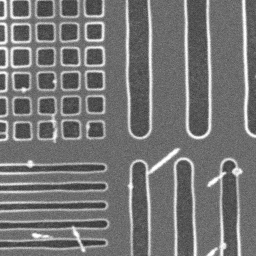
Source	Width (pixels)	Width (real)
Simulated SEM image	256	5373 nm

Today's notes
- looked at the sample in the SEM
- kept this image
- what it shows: groups of lines, slits or small figures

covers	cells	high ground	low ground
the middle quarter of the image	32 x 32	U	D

UUUUUUDDUUUUUUUUDDDDDDUUUUUUUUUD
UUUUUUUUUUUUUUUUDDDDDDUUUUUUUUUD
DDDDUUDDDDUUUUUUDDDDDDUUUUUUUUUD
DDDDUDDDDDUUUUUUDDDDDDUUUUUUUUUD
DDDDUDDDDDUUUUUUDDDDDDUUUUUUUUUD
DDDDUDDDDDUUUUUUDDDDDDUUUUUUUUUD
DDDUUUUDUUUUUUUUDDDDDDUUUUUUUUUD
UUUUUUUUUUUUUUUUDDDDDDUUUUUUUUUD
DDDDUUDDDDUUUUUUDDDDDDUUUUUUUUUD
DDDDUUDDDDUUUUUUDDDDDDUUUUUUUUUD
DDDDUUDDDDUUUUUUDDDDDDUUUUUUUUUD
DDDDUUDDDDUUUUUUDDDDDDUUUUUUUUUD
DDDUUUUUUUUUUUUUDDDDDDUUUUUUUUUD
UUUUUUUUUUUUUUUUDDDDDDUUUUUUUUUD
DDDDUUUDDUUUUUUUDDDDDDUUUUUUUUUD
DDDDUUDDDDUUUUUUDDDDDDUUUUUUUUUD
DDDDUUDDDDUUUUUUDDDDDUUUUUUUUUUD
DDDDUUDDDDUUUUUUUDDDDUUUUUUUUUUU
DDDDUUDDDUUUUUUUUUUUUUUUUUUUUUUU
UUUUUUUUUUUUUUUUUUUUUUUUUUUUUUUU
UUUUUUUUUUUUUUUUUUUUUUUUUUUUUUUU
UUUUUUUUUUUUUUUUUUUUUUUUUUUUUUUU
UUUUUUUUUUUUUUUUUUUUUUUUUUUUUUUU
UUUUUUUUUUUUUUUUUUUUUUUUUUUUUUUU
UUUUUUUUUUUUUUUUUUDDUUUUUUUUDDDU
DDDDDDDDDDUUUUUUUDDDUUUUUUUUDDDD
DDDDDDDDDDUUUUUUUDDDDUUUUUUUDDDD
UUUUUUUUUUUUUUUUUDDDDUUUUUUUDDDD
UUUUUUUUUUUUUUUUUDDDDUUUUUUUDDDD
UUUUUUUUUUUUUUUUUDDDDUUUUUUUDDDD
DDDDDDDDDDDUUUUUUDDDDUUUUUUUDDDD
DDDDDDDDDDUUUUUUUDDDDUUUUUUUDDDD